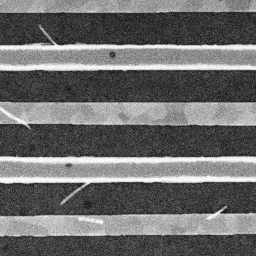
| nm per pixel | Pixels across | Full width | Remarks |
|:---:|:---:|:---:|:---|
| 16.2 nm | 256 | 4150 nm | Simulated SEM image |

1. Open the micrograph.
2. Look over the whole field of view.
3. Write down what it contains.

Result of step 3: lines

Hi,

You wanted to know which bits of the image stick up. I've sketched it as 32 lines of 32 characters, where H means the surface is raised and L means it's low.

HHHHHHHHHHHHHHHHHHHHHHHHHHHHHHHH
HHHHHHHHHHHHHHHHHHHHLLLLLLHLLLLL
LLLLLLLLLLLLLLLLLLLLLLLLLLLLLLLL
LLLLLLLLLLLLLLLLLLLLLLLLLLLLLLLL
LLLLLLLLLLLLLLLLLLLLLLLLLLLLLLLL
LLLLLLLLLLLLLLLLLLLLLLLLLLLLLLLL
HHHHHHHHHHHHHHHHHHHHHHHHHHHHHHHH
HHHHHHHHHHHHHHHHHHHHHHHHHHHHHHHH
HHHHHHHHHHHHHHHHHHHHHHHHHHHHHHHH
LLLLLLLLLLLLLLLLLLLLLLLLLLLLLLLL
LLLLLLLLLLLLLLLLLLLLLLLLLLLLLLLL
LLLLLLLLLLLLLLLLLLLLLLLLLLLLLLLL
LLLLLLLLLLLLLLLLLLLLLLLLLLLLLLLL
HHHHHHHHHHHHHHHHHHHHHHHHHHHHHHHH
HHHHHHHHHHHHHHHHHHHHHHHHHHHHHHHH
LLLHLLLLLLLLLLLLLLHLHHHHHHHHHHHH
LLLLLLLLLLLLLLLLLLLLLLLLLLLLLLLL
LLLLLLLLLLLLLLLLLLLLLLLLLLLLLLLL
LLLLLLLLLLLLLLLLLLLLLLLLLLLLLLLL
LLLLLLLLLLLLLLLLLLLLLLLLLLLLLLLL
HHHHHHHHHHHHHHHHHHHHHHHHHHHHHHHH
HHHHHHHHHHHHHHHHHHHHHHHHHHHHHHHH
HHHHHHHHHHHHHHHHHHHHHHHHHHHHHHHH
LLLLLLLLLLLLLLLLLLLLLLLLLLLLLLLL
LLLLLLLLLLLLLLLLLLLLLLLLLLLLLLLL
LLLLLLLLLLLLLLLLLLLLLLLLLLLLLLLL
LLLLLLLLLLLLLLLLLLLLLLLLLLLLLLLL
HHHHHHHHHHHHHHHHHHHHHHHHHHHHHHHH
HHHHHHHHHHHHHHHHHHHHHHHHHHHHHHHH
LLLLLLLLLLLLLLLLLLLLLLLLLLLLLLLL
LLLLLLLLLLLLLLLLLLLLLLLLLLLLLLLL
LLLLLLLLLLLLLLLLLLLLLLLLLLLLLLLL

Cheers